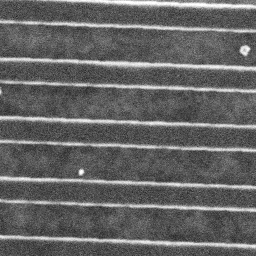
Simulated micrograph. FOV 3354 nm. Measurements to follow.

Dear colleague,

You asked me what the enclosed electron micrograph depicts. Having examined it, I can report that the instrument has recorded lines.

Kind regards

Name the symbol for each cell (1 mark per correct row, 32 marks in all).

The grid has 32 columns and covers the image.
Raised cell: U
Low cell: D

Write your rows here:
UUUUUUUUUUUUUUUUUUUUUUUUUDDDDDDD
UUUUUUUUUUUUUUUUUUUUUUUUUUUUUUUU
UUUUUUUUUUUUUUUUUUUUUUUUUUUUUUUU
DDDDDDDDDDDDDDDDDDDDUUUUUUUUUUUU
DDDDDDDDDDDDDDDDDDDDDDDDDDDDDDDD
DDDDDDDDDDDDDDDDDDDDDDDDDDDDDDDD
DDDDDDDDDDDDDDDDDDDDDDDDDDDDDDDD
UUUUUUDDDDDDDDDDDDDDDDDDDDDDDDDD
UUUUUUUUUUUUUUUUUUUUUUUUUUUUUUUU
UUUUUUUUUUUUUUUUUUUUUUUUUUUUUUUU
DDDDDDUUUUUUUUUUUUUUUUUUUUUUUUUU
DDDDDDDDDDDDDDDDDDDDDDDDDDDDDDDD
DDDDDDDDDDDDDDDDDDDDDDDDDDDDDDDD
DDDDDDDDDDDDDDDDDDDDDDDDDDDDDDDD
DDDDDDDDDDDDDDDDDDDDDDDDDDDDDDDD
UUUUUUUUUUUUUUUUUUUUUUUUDDDDDDDD
UUUUUUUUUUUUUUUUUUUUUUUUUUUUUUUU
UUUUUUUUUUUUUUUUUUUUUUUUUUUUUUUU
DDDDDDDDDDDDDDDDDDDDDUUUUUUUUUUU
DDDDDDDDDDDDDDDDDDDDDDDDDDDDDDDD
DDDDDDDDDDDDDDDDDDDDDDDDDDDDDDDD
DDDDDDDDDDDDDDDDDDDDDDDDDDDDDDDD
UUUUUUUUUUUDDDDDDDDDDDDDDDDDDDDD
UUUUUUUUUUUUUUUUUUUUUUUUUUUUUUUU
UUUUUUUUUUUUUUUUUUUUUUUUUUUUUUUU
DDDDDDDUUUUUUUUUUUUUUUUUUUUUUUUU
DDDDDDDDDDDDDDDDDDDDDDDDDDDDDDDD
DDDDDDDDDDDDDDDDDDDDDDDDDDDDDDDD
DDDDDDDDDDDDDDDDDDDDDDDDDDDDDDDD
DDDDDDDDDDDDDDDDDDDDDDDDDDDDDDDD
UUUUUUUUUUUUUUUUUUUUUUUUUUUUDDDD
UUUUUUUUUUUUUUUUUUUUUUUUUUUUUUUU